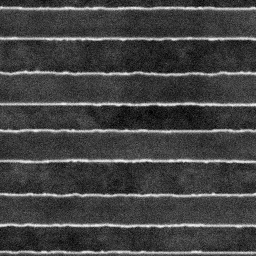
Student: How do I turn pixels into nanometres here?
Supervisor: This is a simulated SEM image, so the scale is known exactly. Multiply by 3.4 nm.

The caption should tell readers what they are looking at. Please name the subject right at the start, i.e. lines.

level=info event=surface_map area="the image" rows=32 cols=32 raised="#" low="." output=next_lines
................................
################################
################################
################################
################################
................................
................................
................................
................................
################################
################################
################################
################################
................................
................................
................................
################################
################################
################################
################################
................................
................................
................................
................................
################################
################################
################################
################################
................................
................................
................................
#########.##########....##......